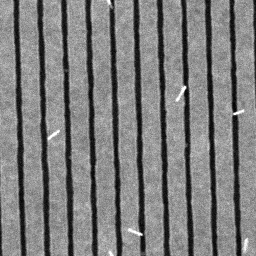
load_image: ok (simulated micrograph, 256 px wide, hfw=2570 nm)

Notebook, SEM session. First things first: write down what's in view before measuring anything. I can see parallel lines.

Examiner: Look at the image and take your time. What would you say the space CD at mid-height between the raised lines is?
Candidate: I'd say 63.9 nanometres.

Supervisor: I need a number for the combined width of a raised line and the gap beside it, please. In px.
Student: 23.9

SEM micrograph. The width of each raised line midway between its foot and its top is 17.5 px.